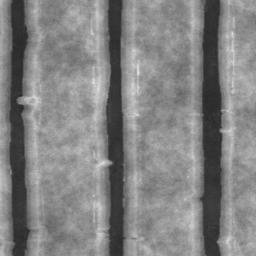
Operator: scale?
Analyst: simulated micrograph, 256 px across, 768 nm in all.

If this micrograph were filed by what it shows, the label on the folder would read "one or a few lines or trenches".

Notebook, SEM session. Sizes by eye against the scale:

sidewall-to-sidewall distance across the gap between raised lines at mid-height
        91.6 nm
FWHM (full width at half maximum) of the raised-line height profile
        197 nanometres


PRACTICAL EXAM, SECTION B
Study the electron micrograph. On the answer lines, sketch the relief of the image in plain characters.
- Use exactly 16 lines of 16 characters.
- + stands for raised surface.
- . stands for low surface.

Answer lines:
..++++..++++..++
..++++..++++..++
..++++..++++..++
..++++..++++..++
..++++..++++..++
..++++..++++..++
..++++..++++..++
..++++..++++..++
..++++..++++..++
..++++..++++..++
..++++..++++..++
..++++..++++..++
..++++..++++..++
..++++..++++..++
..++++..++++..++
..++++..++++..++